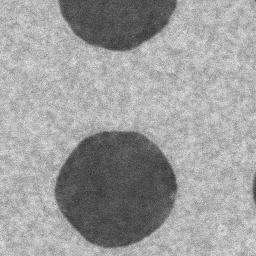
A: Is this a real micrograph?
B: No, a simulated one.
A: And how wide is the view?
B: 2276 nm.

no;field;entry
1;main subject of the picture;holes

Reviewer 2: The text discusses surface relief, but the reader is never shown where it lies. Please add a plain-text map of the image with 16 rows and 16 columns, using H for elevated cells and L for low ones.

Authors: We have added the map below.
HHHHLLLLLLLHHHHH
HHHHLLLLLLHHHHHH
HHHHHLLLLHHHHHHH
HHHHHHHHHHHHHHHH
HHHHHHHHHHHHHHHH
HHHHHHHHHHHHHHHH
HHHHHHHHHHHHHHHH
HHHHHHHHHHHHHHHH
HHHHHHLLLHHHHHHH
HHHHLLLLLLHHHHHH
HHHHLLLLLLLHHHHH
HHHLLLLLLLLHHHHH
HHHHLLLLLLLHHHHH
HHHHLLLLLLLHHHHH
HHHHHLLLLLHHHHHH
HHHHHHHHHHHHHHHH